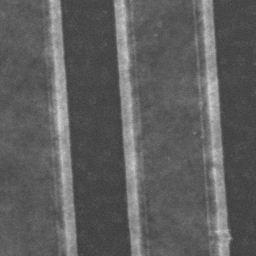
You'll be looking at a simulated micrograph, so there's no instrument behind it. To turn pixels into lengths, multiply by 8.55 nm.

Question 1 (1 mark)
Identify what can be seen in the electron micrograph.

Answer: one or a few lines or trenches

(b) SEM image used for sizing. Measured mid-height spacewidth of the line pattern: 554 nm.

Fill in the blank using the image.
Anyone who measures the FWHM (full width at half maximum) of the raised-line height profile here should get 741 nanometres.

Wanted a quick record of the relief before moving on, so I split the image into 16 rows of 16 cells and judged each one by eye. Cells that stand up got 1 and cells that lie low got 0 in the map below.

1110000111111000
1111000011111000
1111000011111000
1111000011111000
1111000011111000
1111000011111000
1111000011111000
1111000011111000
1111000011111000
1111000011111100
1111000011111100
1111000011111100
1111000011111100
1111000011111100
1111000011111100
1111000001111100